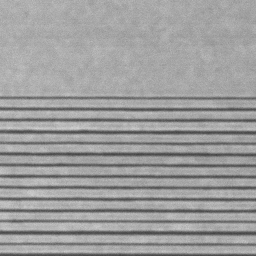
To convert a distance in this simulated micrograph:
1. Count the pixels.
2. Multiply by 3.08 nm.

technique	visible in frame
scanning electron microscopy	parallel lines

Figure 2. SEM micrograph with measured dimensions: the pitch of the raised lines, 34.5 nm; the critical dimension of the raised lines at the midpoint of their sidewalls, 0.0242 µm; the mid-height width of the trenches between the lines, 11.9 nanometers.